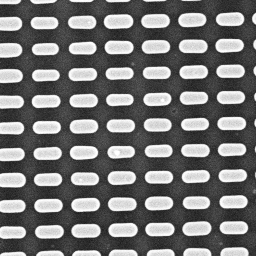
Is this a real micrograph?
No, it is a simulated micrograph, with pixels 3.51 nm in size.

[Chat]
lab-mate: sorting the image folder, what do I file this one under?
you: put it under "groups of lines, slits or small figures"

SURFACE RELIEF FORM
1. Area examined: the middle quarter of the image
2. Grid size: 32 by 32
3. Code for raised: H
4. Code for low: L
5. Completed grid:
LLLLLLLLLLLLLLLLLLLLLLLLLLLLLLLL
LLHHHHHHLLLHHHHHHLLLHHHHHHLLLHHH
LHHHHHHHLLLHHHHHHLLLHHHHHHLLLHHH
LLHHHHHHLLLHHHHHHLLLLLLLLLLLLLLL
LLLLLLLLLLLLLLLLLLLLLLLLLLLLLLLL
LLLLLLLLLLLLLLLLLLLLLLLLLLLLLLLL
LLLLLLLLLLLLLLLLLLLLLLLLLLLLLLLL
LLLLLLLLLLLLLLLLLLLLLLLHHHLLLHHH
LLHHHHHHLLLHHHHHHLLLHHHHHHHLLHHH
LLHHHHHHLLLHHHHHHLLLHHHHHHLLLHHH
LLHHHHHLLLLLLLLLLLLLLLLLLLLLLLLL
LLLLLLLLLLLLLLLLLLLLLLLLLLLLLLLL
LLLLLLLLLLLLLLLLLLLLLLLLLLLLLLLL
LLLLLLLLLLLLLLLLLLLLLLLLLLLLLLLL
LLHHHHHHLLLHHHHHHLLLHHHHHHHLLLHH
LLHHHHHHLLLHHHHHHHLLHHHHHHHLLHHH
LLHHHHHHLLLHHHHHHLLLLHHHHHLLLLLL
LLLLLLLLLLLLLLLLLLLLLLLLLLLLLLLL
LLLLLLLLLLLLLLLLLLLLLLLLLLLLLLLL
LLLLLLLLLLLLLLLLLLLLLLLLLLLLLLLL
LLLLLLLLLLLLLLLLLLLLLLLHHHLLLLHH
LLHHHHHHLLLHHHHHHHLLHHHHHHHLLHHH
LLHHHHHHLLLHHHHHHHLLHHHHHHHLLLHH
LLHHHHHLLLLLLLLLLLLLLLLLLLLLLLLL
LLLLLLLLLLLLLLLLLLLLLLLLLLLLLLLL
LLLLLLLLLLLLLLLLLLLLLLLLLLLLLLLL
LLLLLLLLLLLLLLLLLLLLLLLLLLLLLLLL
LLHHHHHHLLLHHHHHHHLLHHHHHHHLLLHH
LLHHHHHHHLLHHHHHHHLLHHHHHHHLLLHH
LLHHHHHHLLLHHHHHHLLLLHHHHHLLLLHH
LLLLLLLLLLLLLLLLLLLLLLLLLLLLLLLL
LLLLLLLLLLLLLLLLLLLLLLLLLLLLLLLL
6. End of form